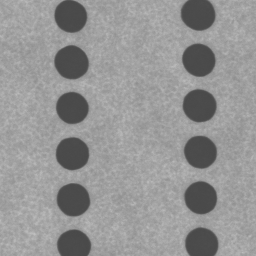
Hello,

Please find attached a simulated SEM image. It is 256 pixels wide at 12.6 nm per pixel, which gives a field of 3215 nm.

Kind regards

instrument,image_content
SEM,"a regular array of holes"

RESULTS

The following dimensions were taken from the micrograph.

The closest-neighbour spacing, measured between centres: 0.575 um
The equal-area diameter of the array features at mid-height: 410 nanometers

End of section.